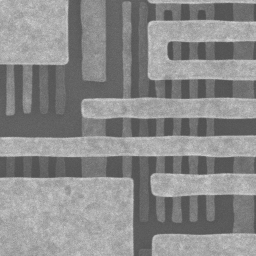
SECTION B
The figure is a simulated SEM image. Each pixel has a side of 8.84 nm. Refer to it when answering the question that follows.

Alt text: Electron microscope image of wiring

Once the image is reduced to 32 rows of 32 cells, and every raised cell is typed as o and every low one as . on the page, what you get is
ooooooooo.......................
oooooooo........................
oooooooo........................
oooooooo...........ooooooooooooo
oooooooo...........ooooooooooooo
oooooooo...........oo...........
ooooooooo..........oo...........
ooooooooo..........ooo.ooo..ooo.
...................ooooooooooooo
...................ooooooooooooo
................................
................................
...........ooooooooooooooooooooo
..........oooooooooooooooooooooo
...........ooooooooooooooooooooo
................................
................................
oooooooooooooooooooooooooooooooo
oooooooooooooooooooooooooooooooo
oo....oooooooo............oooooo
................................
................................
oooooooooooooooo...ooooooooooooo
ooooooooooooooooo..ooooooooooooo
ooooooooooooooooo...ooo.........
ooooooooooooooooo...............
ooooooooooooooooo...............
ooooooooooooooooo...............
ooooooooooooooooo...............
ooooooooooooooooo..ooooooooooooo
ooooooooooooooooo..ooooooooooooo
ooooooooooooooooo..ooooooooooooo